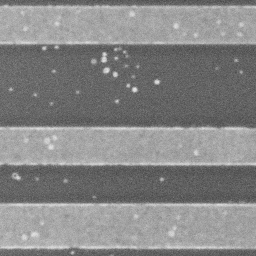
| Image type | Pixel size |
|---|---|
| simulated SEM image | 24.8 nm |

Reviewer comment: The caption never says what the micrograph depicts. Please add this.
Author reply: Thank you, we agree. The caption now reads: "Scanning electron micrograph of lines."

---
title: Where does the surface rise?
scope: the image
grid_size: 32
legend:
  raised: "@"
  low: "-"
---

--------------------------------
@@@@@@@@@@@@@@@@@@@@@@@@@@@@@@@@
@@@@@@@@@@@@@@@@@@@@@@@@@@@@@@@@
@@@@@@@@@@@@@@@@@@@@@@@@@@@@@@@@
@@@@@@@@@@@@@@@@@@@@@@@@@@@@@@@@
--------------------------------
--------------------------------
--------------------------------
--------------------------------
--------------------------------
--------------------------------
--------------------------------
--------------------------------
--------------------------------
--------------------------------
--------------------------------
@@@@@@@@@@@@@@@@@@@@@@@@@@@@@@@@
@@@@@@@@@@@@@@@@@@@@@@@@@@@@@@@@
@@@@@@@@@@@@@@@@@@@@@@@@@@@@@@@@
@@@@@@@@@@@@@@@@@@@@@@@@@@@@@@@@
-@@@@--@-@-@@@@@@@@@@@@@@@@@@@@@
--------------------------------
--------------------------------
--------------------------------
--------------------------------
--------------------------------
@@@@@@@@@@@@@@@@@@@@@@@@@@@@@@@@
@@@@@@@@@@@@@@@@@@@@@@@@@@@@@@@@
@@@@@@@@@@@@@@@@@@@@@@@@@@@@@@@@
@@@@@@@@@@@@@@@@@@@@@@@@@@@@@@@@
@@@@@@@@@@@@@@@@@@@@@@@@@@@@@@@@
--------------------------------